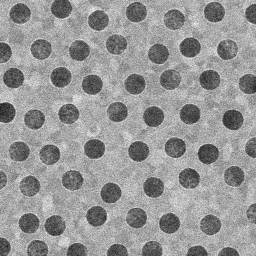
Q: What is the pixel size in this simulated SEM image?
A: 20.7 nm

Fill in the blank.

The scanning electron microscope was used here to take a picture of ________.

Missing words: a regular array of holes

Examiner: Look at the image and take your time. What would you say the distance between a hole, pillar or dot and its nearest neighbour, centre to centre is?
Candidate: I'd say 695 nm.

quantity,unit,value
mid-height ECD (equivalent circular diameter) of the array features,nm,446